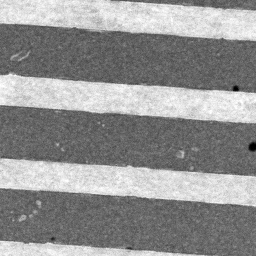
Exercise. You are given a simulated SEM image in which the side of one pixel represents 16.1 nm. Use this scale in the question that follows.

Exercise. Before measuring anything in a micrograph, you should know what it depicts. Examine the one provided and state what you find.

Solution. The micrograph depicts one or a few lines or trenches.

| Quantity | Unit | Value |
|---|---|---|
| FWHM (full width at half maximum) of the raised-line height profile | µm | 0.471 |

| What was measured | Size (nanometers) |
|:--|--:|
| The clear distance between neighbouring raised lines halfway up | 856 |